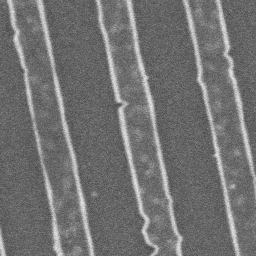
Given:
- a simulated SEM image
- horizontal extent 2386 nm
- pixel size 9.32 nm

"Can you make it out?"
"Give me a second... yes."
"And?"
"one or a few lines or trenches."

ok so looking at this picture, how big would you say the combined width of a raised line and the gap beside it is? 0.811 um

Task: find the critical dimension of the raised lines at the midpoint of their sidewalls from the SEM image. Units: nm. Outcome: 290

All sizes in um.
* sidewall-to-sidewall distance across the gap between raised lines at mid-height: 0.516